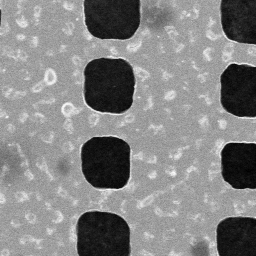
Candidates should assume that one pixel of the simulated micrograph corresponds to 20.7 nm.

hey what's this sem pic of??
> holes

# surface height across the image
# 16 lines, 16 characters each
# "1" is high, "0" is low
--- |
1111100001111100
1111100001111100
1111111111111100
1111111111111111
1111100011111100
1111100011111100
1111110011111100
1111111111111111
1111111111111111
1111100011111100
1111100011111100
1111110011111100
1111111111111111
1111100111111111
1111100011111100
1111100011111100